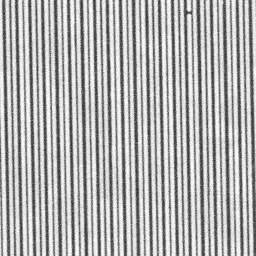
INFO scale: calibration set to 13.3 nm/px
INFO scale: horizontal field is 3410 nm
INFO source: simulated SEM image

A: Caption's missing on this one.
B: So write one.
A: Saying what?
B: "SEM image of parallel lines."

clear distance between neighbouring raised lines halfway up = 4.12 pixels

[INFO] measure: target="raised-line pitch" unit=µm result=0.0863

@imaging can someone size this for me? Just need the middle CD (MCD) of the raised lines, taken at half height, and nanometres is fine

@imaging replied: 33.3